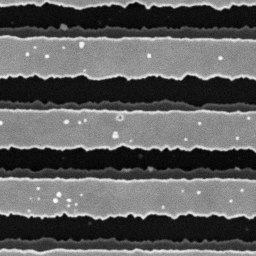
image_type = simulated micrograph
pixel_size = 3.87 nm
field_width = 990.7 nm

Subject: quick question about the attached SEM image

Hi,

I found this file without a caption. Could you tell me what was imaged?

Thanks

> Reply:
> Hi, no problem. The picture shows lines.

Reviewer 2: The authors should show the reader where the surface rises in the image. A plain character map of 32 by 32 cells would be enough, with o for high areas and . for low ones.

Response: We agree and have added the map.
ooooo..ooooooooo..oooooooooooooo
................................
................................
................................
oo..............................
oooooooooooooooooooooooooooooooo
oooooooooooooooooooooooooooooooo
oooooooooooooooooooooooooooooooo
oooooooooooooooooooooooooooooooo
oo.o.ooooo.oooooooo.ooo.oooooooo
................................
................................
................................
................................
oooooooooooooooooooooooooooooooo
oooooooooooooooooooooooooooooooo
oooooooooooooooooooooooooooooooo
oooooooooooooooooooooooooooooooo
o.oo.oooo.ooooo.o.oooooo.ooooooo
................................
................................
................................
oooooooooooooooooooooooooooooooo
oooooooooooooooooooooooooooooooo
oooooooooooooooooooooooooooooooo
oooooooooooooooooooooooooooooooo
oooooooooooooooooooooooooooooooo
................................
................................
................................
................................
oooooooooooooooooooooooooooooooo